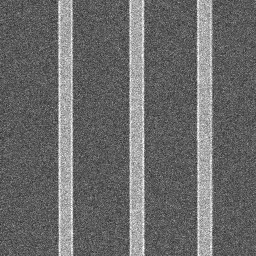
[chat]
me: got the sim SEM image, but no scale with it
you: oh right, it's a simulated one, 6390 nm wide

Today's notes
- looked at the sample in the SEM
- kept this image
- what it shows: one or a few lines or trenches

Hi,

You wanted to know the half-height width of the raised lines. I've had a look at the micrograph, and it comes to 0.331 um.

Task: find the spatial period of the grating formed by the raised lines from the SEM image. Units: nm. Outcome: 1730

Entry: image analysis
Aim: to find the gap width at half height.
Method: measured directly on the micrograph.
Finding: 1410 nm